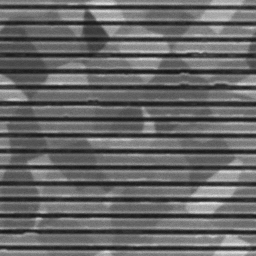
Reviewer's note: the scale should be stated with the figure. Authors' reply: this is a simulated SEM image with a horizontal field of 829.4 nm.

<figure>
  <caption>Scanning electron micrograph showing parallel lines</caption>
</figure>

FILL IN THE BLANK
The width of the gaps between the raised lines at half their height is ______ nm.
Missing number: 19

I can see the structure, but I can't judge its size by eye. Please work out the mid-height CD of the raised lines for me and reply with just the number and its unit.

32.8 nm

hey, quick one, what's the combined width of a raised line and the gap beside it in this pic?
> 0.0521 um